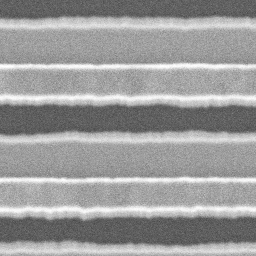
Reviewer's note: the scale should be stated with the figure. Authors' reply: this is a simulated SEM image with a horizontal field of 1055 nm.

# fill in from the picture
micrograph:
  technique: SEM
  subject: lines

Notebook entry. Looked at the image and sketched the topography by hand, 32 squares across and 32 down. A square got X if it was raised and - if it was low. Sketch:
--------------------------------
--------------------------------
--------------------------------
XXXXXXXXXXXXXXXXXXXXXXXXXXXXXXXX
XXXXXXXXXXXXXXXXXXXXXXXXXXXXXXXX
XXXXXXXXXXXXXXXXXXXXXXXXXXXXXXXX
XXXXXXXXXXXXXXXXXXXXXXXXXXXXXXXX
XXXXXXXXXXXXXXXXXXXXXXXXXXXXXXXX
XXXXXXXXXXXXXXXXXXXXXXXXXXXXXXXX
XXXXXXXXXXXXXXXXXXXXXXXXXXXXXXXX
XXXXXXXXXXXXXXXXXXXXXXXXXXXXXXXX
XXXXXXXXXXXXXXXXXXXXXXXXXXXXXXXX
----X-------X--XX-----XXXX-X--XX
--------------------------------
--------------------------------
--------------------------------
--------------------------------
XXXXXXXXXXXXXXXXXXXXXXXXXXXXXXXX
XXXXXXXXXXXXXXXXXXXXXXXXXXXXXXXX
XXXXXXXXXXXXXXXXXXXXXXXXXXXXXXXX
XXXXXXXXXXXXXXXXXXXXXXXXXXXXXXXX
XXXXXXXXXXXXXXXXXXXXXXXXXXXXXXXX
XXXXXXXXXXXXXXXXXXXXXXXXXXXXXXXX
XXXXXXXXXXXXXXXXXXXXXXXXXXXXXXXX
XXXXXXXXXXXXXXXXXXXXXXXXXXXXXXXX
XXXXXXXXXXXXXXXXXXXXXXXXXXXXXXXX
-XX--XX---XX-X----X----X--------
--------------------------------
--------------------------------
--------------------------------
--------------------------------
XXXXXXXXXXXXXXXXXXXXXXXXXXXXXXXX